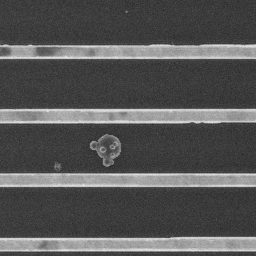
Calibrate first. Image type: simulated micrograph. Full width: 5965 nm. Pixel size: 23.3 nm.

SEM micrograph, lines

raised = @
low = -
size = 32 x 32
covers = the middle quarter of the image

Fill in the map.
--------------------------------
--------------------------------
--------------------------------
--------------------------------
--------------------------------
--------------------------------
--------------------------------
--------------------------------
--------------------------------
--------------------------------
--------------------------------
@@@@@@@@@@@@@@@@@@@@@@@@@@@@@@@@
@@@@@@@@@@@@@@@@@@@@@@@@@@@@@@@@
@@@@@@@@@@@@@@@@@@@@@@@@@@@@@@@@
@@@@@-@@@@@@@@@@@@@@@@@@@@@@@@--
--------------------------------
--------------------------------
--------------------------------
--------------------------------
--------------------------------
--------------------------------
--------------------------------
--------------------------------
--------------------------------
--------------------------------
--------------------------------
--------------------------------
--------------------------------
@@@@@@@@@@@@@@@@@@@@@@@@@@@@@@@@
@@@@@@@@@@@@@@@@@@@@@@@@@@@@@@@@
@@@@@@@@@@@@@@@@@@@@@@@@@@@@@@@@
--------------------------------